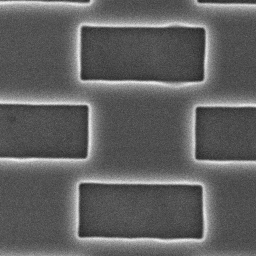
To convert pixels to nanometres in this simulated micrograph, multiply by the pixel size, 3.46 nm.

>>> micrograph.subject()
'groups of lines, slits or small figures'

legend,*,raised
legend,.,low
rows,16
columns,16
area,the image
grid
****************
****************
*****........***
*****........***
*****........***
****************
.....***********
......******....
......******....
.....*******....
****************
*****.......****
*****........***
*****........***
*****........***
****************